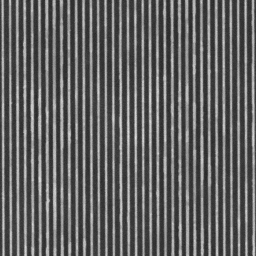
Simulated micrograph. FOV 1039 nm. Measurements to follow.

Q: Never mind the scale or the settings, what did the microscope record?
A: parallel lines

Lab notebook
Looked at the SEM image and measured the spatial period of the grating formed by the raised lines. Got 29.9 nm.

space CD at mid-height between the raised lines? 22.3 nanometers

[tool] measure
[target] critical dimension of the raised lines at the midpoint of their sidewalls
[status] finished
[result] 7.6 nm